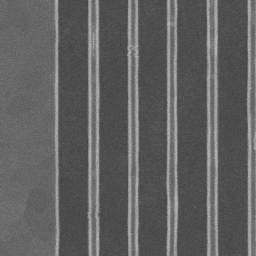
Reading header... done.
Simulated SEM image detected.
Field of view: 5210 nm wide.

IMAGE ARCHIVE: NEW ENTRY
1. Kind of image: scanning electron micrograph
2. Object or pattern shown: parallel lines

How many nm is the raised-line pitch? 803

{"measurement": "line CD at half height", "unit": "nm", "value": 160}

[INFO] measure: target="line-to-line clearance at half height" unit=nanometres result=651